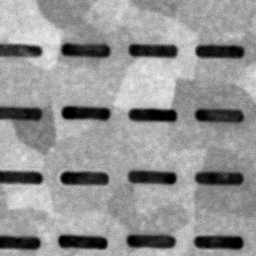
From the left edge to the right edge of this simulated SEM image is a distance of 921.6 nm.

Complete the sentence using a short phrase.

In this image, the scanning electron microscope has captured a regular array of holes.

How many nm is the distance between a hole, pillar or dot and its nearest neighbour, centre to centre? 227